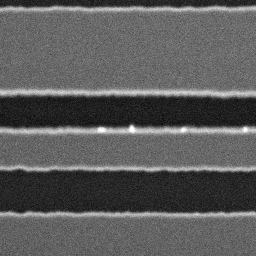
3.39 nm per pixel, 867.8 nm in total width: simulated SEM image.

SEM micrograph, lines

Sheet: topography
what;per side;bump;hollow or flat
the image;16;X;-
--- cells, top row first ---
---X---------X-X
XXXXXXXXXXXXXXXX
XXXXXXXXXXXXXXXX
XXXXXXXXXXXXXXXX
XXXXXXXXXXXXXXXX
XXXXXXXXXXXXXXXX
----------------
----------------
XXXXXXXXXXXXXXXX
XXXXXXXXXXXXXXXX
XXXXXXXXXXXXXXXX
----------------
----------------
XXXXXXXXXXXXXXXX
XXXXXXXXXXXXXXXX
XXXXXXXXXXXXXXXX